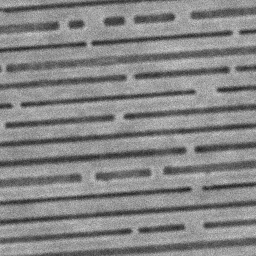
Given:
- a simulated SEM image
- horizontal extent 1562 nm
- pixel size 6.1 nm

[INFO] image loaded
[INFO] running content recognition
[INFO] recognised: parallel lines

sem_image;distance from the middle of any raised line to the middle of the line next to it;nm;117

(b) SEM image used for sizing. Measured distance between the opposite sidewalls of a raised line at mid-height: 72.9 nm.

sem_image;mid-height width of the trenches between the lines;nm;39.5